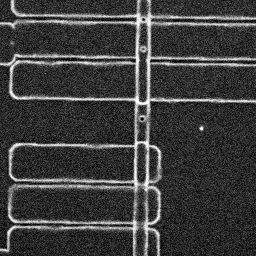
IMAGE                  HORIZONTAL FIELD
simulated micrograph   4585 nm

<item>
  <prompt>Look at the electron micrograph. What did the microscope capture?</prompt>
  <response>wiring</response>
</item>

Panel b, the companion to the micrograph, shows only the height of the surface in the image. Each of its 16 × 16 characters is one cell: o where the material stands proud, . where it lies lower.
.ooooooooooooooo
oooooooooooooooo
oooooooooooooooo
oooooooooooooooo
.ooooooooooooooo
.ooooooooooooooo
........o.......
................
........o.......
.ooooooooo......
.ooooooooo......
.ooooooooo......
.ooooooooo......
.ooooooooo......
.ooooooooo......
oooooooooo......